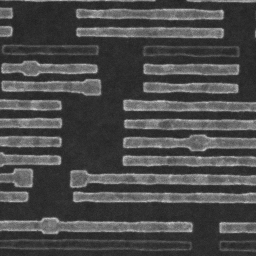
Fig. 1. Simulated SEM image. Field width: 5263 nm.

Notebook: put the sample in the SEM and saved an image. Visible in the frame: wiring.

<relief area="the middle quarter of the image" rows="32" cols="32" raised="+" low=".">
++++++++............++++++++++++
++++++++............++++++++++++
................................
................................
.....++++.......................
+++++++++...........++++++++++++
+++++++++...........++++++++++++
.....++++.......................
................................
...............++++++++++++++...
...............+++++++++++++++++
...............+++++++++++++++++
................................
................................
...............+++++++++++++++++
...............+++++++++++++++++
................................
................................
...............................+
...............+++++++++++++++++
...............+++++++++++++++++
................................
................................
...............+++++++++++++++++
...............+++++++++++++++++
................................
................................
..++++.........+++..............
..++++++++++++++++++++++++++++++
..++++++++++++++++++++++++++++++
..+++...........................
................................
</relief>